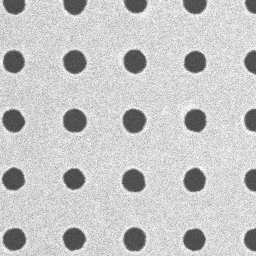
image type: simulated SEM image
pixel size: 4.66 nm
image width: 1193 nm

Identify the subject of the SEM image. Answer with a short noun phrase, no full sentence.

a regular array of holes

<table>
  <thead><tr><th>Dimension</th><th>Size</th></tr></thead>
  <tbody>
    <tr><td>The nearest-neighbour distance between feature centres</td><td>274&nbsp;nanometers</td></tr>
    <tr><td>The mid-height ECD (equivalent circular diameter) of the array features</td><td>22.6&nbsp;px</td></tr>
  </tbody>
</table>